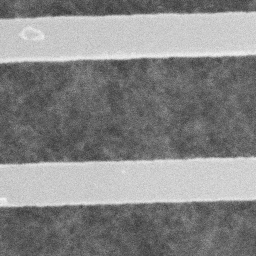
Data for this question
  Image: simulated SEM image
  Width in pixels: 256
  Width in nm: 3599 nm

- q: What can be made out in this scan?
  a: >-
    lines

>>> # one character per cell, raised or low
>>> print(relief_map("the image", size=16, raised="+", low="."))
................
++++++++++++++++
++++++++++++++++
+++++++++++++...
................
................
................
................
................
................
++++++++++++++++
++++++++++++++++
++++++++++++++..
................
................
................